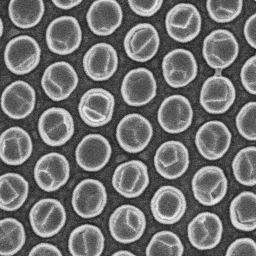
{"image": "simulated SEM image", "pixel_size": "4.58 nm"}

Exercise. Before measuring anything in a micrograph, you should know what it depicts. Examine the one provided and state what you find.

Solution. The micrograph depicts a regular array of raised bodies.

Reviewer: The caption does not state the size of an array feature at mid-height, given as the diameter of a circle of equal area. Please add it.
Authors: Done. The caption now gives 160 nm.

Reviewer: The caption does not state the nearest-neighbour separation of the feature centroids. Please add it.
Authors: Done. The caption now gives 208 nm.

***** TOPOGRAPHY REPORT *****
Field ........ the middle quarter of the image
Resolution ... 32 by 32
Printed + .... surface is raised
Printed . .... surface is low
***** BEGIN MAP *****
+....++++++++............+++++++
++....+++++++.....++.....+++++++
+++...++++++....++++++...+++++++
+++....++++....+++++++...+++++++
+++............++++++++...+++++.
+++............++++++++....++...
++.....++......++++++++.........
+....++++++....++++++++.........
.....+++++++...+++++++....++++..
....++++++++....+++++....++++++.
....++++++++............+++++++.
....++++++++............++++++++
+...++++++++............++++++++
++...++++++....+++++....++++++++
++....++++....+++++++...+++++++.
++............++++++++...++++++.
++...........+++++++++....++++..
++...........+++++++++..........
+....+++++....++++++++..........
....+++++++...+++++++...........
....+++++++....+++++....++++++..
...+++++++++....+++.....++++++..
...++++++++............++++++++.
...++++++++............++++++++.
+...+++++++......+.....++++++++.
+...++++++....++++++...++++++++.
+......+.....+++++++...+++++++..
+............++++++++...+++++...
+...........+++++++++...........
.....+++....+++++++++...........
....+++++....+++++++............
...+++++++...+++++++....++++....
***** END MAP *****